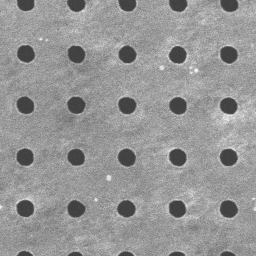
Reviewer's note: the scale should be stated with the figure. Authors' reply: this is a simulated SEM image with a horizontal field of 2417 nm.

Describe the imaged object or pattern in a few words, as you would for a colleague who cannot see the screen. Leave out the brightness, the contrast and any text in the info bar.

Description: a regular array of holes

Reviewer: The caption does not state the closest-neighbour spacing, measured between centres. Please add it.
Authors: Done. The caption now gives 479 nm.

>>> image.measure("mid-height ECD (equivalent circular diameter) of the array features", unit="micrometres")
0.168